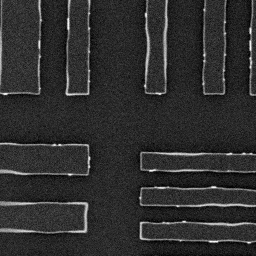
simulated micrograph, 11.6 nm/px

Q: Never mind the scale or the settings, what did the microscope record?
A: groups of lines, slits or small figures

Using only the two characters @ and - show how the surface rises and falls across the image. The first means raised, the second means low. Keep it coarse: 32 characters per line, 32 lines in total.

@@@@@----@@-------@@@-----@@----
@@@@@----@@-------@@@-----@@----
@@@@@----@@-------@@@-----@@---@
@@@@@----@@-------@@@-----@@---@
@@@@@---@@@-------@@@----@@@---@
@@@@@---@@@--------@@----@@@---@
@@@@@---@@@-------@@@-----@@---@
@@@@@---@@@-------@@@-----@@---@
@@@@@---@@@-------@@@----@@@---@
@@@@@---@@@-------@@@----@@@---@
@@@@@---@@@-------@@@----@@@---@
@@@@@---@@@-------@@@-----@@---@
--------------------------------
--------------------------------
--------------------------------
--------------------------------
--------------------------------
--------------------------------
@@@@@@@@@@@---------------------
@@@@@@@@@@@-------@@@@@@@@@@@@@@
@@@@@@@@@@@-------@@@@@@@@@@@@@@
-@@@@@@@@@@------------------@@@
--------------------------------
------------------@@@@----@@----
------------------@@@@@@@@@@@@@@
@@@@@@@@@@@-------@@@@@@@@@@@@@@
@@@@@@@@@@@---------------------
@@@@@@@@@@@---------------------
@@@@@@@@@@@-------@@@@@@@@@@@@@@
------------------@@@@@@@@@@@@@@
--------------------------------
--------------------------------